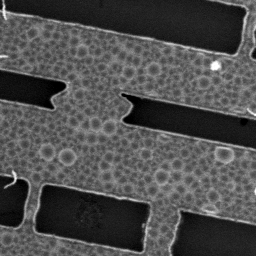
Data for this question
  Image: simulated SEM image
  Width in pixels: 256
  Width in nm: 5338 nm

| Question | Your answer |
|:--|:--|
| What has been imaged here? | one or a few lines or trenches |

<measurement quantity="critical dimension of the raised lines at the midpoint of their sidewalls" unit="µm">1.37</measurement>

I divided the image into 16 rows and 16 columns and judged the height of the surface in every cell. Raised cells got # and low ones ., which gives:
...............#
####...........#
##########.....#
################
.###############
....############
#..#####...#####
########........
###########.....
################
################
..##############
........########
.........##..###
##.......##.....
#######..##.....